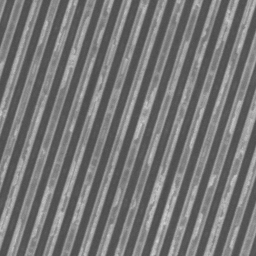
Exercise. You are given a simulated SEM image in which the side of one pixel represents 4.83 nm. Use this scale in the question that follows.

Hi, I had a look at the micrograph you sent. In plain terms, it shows parallel lines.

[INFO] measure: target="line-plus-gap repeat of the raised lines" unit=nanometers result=82.4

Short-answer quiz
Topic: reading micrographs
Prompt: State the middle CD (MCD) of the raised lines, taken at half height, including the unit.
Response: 33.4 nm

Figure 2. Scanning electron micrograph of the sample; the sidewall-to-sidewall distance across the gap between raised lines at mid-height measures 47.8 nanometers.